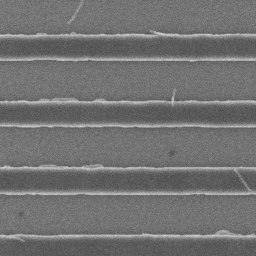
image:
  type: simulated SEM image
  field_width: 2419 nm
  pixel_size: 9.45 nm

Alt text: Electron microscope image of lines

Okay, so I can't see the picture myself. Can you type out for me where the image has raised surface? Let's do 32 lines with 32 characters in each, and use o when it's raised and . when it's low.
................................
................................
................................
................................
ooo.oooooooooooooooooooooooooooo
oooooooooooooooooooooooooooooooo
oooooooooooooooooooooooooooooooo
oooo...ooooooooooooooooooooooooo
................................
................................
................................
................................
................................
oooooooooooooooooooooooooooooooo
oooooooooooooooooooooooooooooooo
oooooooooooooooooooooooooooooooo
................................
................................
................................
................................
................................
oooooooooooooooooooooooooooooooo
oooooooooooooooooooooooooooooooo
oooooooooooooooooooooooooooooooo
................................
................................
................................
................................
................................
oooo....ooooooooooooooooo.ooo...
oooooooooooooooooooooooooooooooo
oooooooooooooooooooooooooooooooo